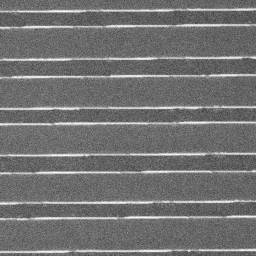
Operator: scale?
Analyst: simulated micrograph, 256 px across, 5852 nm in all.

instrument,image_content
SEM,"lines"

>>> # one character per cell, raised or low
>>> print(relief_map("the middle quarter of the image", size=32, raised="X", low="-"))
--------------------------------
--------------------------------
--------------------------------
XXXXXXXXXXXXXXXXXXXXXXXXXXXXXXXX
XXXXXXXXXXXXXXXXXXXXXXXXXXXXXXXX
XXXXXXXXXXXXXXXXXXXXXXXXXXXXXXXX
XXXXXXXXXXXXXXXXXXXXXXXXXXXXXXXX
XXXXXXXXXXXXXXXXXXXXXXXXXXXXXXXX
XXXXXXXXXXXXXXXXXXXXXXXXXXXXXXXX
XXXXXXXXXXXXXXXXXXXXXXXXXXXXXXXX
XXXXXXXXXXXXXXXXXXXXXXXXXXXXXXXX
--------------------------------
--------------------------------
--------------------------------
--------------------------------
XXXXXXXXXXXXXXXXXXXXXXXXXXXXXXXX
XXXXXXXXXXXXXXXXXXXXXXXXXXXXXXXX
XXXXXXXXXXXXXXXXXXXXXXXXXXXXXXXX
XXXXXXXXXXXXXXXXXXXXXXXXXXXXXXXX
XXXXXXXXXXXXXXXXXXXXXXXXXXXXXXXX
XXXXXXXXXXXXXXXXXXXXXXXXXXXXXXXX
XXXXXXXXXXXXXXXXXXXXXXXXXXXXXXXX
XXXXXXXXXXXXXXXXXXXXXXXXXXXXX-XX
--------------------------------
--------------------------------
--------------------------------
--------------------------------
XXXXXXXXXXXXXXXXXXXXXXXXXXXXXXXX
XXXXXXXXXXXXXXXXXXXXXXXXXXXXXXXX
XXXXXXXXXXXXXXXXXXXXXXXXXXXXXXXX
XXXXXXXXXXXXXXXXXXXXXXXXXXXXXXXX
XXXXXXXXXXXXXXXXXXXXXXXXXXXXXXXX